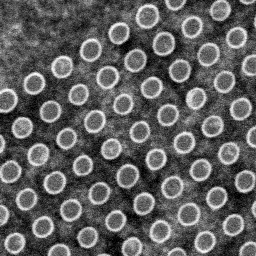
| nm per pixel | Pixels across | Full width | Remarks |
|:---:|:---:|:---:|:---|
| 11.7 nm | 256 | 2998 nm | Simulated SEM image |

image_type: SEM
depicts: a regular array of raised bodies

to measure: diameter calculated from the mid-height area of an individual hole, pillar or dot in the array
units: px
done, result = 19.8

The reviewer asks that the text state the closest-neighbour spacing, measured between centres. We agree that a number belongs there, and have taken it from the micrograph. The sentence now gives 372 nm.